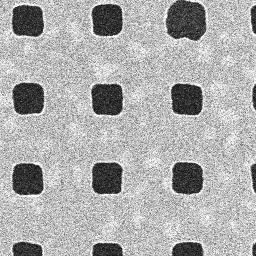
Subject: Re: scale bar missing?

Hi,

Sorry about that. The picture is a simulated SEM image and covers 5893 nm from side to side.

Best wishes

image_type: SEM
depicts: a regular array of holes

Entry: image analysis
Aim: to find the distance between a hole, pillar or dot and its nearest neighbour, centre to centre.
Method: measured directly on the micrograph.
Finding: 1810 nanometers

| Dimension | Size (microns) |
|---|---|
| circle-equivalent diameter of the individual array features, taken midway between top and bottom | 0.79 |